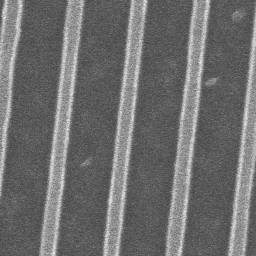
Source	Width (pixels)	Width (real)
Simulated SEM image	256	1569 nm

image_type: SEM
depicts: one or a few lines or trenches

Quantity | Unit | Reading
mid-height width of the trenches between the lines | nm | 295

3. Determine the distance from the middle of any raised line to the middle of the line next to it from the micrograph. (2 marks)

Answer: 383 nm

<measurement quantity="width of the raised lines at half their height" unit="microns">0.089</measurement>